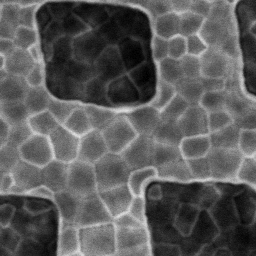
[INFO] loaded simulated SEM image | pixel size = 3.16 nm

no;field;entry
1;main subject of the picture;holes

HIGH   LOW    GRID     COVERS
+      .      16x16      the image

++......+++++++.
++.......++++++.
++.......++++++.
+++.......+++++.
+++.......+++++.
+++.......+++++.
++++++...+++++++
++++++++++++++++
++++++++++++++++
++++++++++++++++
++++++++++++++++
+++++++++......+
...++++++.......
....+++++.......
....+++++.......
....+++++.......